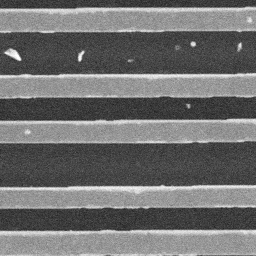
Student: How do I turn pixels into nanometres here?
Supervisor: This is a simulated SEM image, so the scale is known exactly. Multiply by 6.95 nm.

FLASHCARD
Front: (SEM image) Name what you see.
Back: lines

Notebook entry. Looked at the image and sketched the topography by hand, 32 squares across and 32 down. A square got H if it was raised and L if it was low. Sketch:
LLLLLLLLLLLLLLLLLLLLLLLLLLLLLLLL
HHHHHHHHHHHHHHHHHHHHHHHHHHHHHHHH
HHHHHHHHHHHHHHHHHHHHHHHHHHHHHHHH
HHHHHHHHHHHHHHHHHHHHHHHHHHHHHHHH
LLLLLLLLLLLLLLLLLLLLLLLLLLLLLLLL
LLLLLLLLLLLLLLLLLLLLLLLLLLLLLLLL
LLLLLLLLLLLLLLLLLLLLLLLLLLLLLLLL
LLLLLLLLLLLLLLLLLLLLLLLLLLLLLLLL
LLLLLLLLLLLLLLLLLLLLLLLLLLLLLLLL
HHHHHHHHHHHHHHHHHHHHHHHHHHHHHHHH
HHHHHHHHHHHHHHHHHHHHHHHHHHHHHHHH
HHHHHHHHHHHHHHHHHHHHHHHHHHHHHHHH
LLLLLLLLLLLLLLLLLLLLLLLLLLLLLLLL
LLLLLLLLLLLLLLLLLLLLLLLLLLLLLLLL
LLLLLLLLLLLLLLLLLLLLLLLLLLLLLLLL
HHHHHHHHHHHHHHHHHHHHHHHHHHHHHHHH
HHHHHHHHHHHHHHHHHHHHHHHHHHHHHHHH
HHHHHHHHHHHHHHHHHHHHHHHHHHHHHHHH
LLLLLLLLLLLLLLLLLLLLLLLLLLLLLLLL
LLLLLLLLLLLLLLLLLLLLLLLLLLLLLLLL
LLLLLLLLLLLLLLLLLLLLLLLLLLLLLLLL
LLLLLLLLLLLLLLLLLLLLLLLLLLLLLLLL
LLLLLLLLLLLLLLLLLLLLLLLLLLLLLLLL
LLLLLLLLLLLLLLLLLLHHHHHHHHHHHHHH
HHHHHHHHHHHHHHHHHHHHHHHHHHHHHHHH
HHHHHHHHHHHHHHHHHHHHHHHHHHHHHHHH
LLLLLLLLLLLLLLLLLLLLLLLLLLLLLLLL
LLLLLLLLLLLLLLLLLLLLLLLLLLLLLLLL
LLLLLLLLLLLLLLLLLLLLLLLLLLLLLLLL
HHHHHHHHHHHHHHHHHHHHHHHHHHHHHHHH
HHHHHHHHHHHHHHHHHHHHHHHHHHHHHHHH
HHHHHHHHHHHHHHHHHHHHHHHHHHHHHHHH